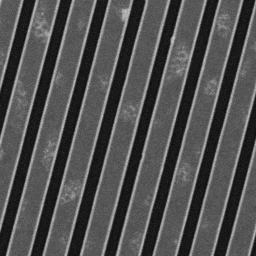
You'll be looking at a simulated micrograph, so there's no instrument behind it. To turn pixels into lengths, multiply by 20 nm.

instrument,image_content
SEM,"parallel lines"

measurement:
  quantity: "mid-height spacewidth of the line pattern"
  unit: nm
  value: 284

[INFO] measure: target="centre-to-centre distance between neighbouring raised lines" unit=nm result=710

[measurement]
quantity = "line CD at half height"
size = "424 nm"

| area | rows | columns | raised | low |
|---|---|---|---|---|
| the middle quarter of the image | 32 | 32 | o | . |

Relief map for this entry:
oooo...oooooo...oooooo....ooooo.
ooo....oooooo...oooooo...oooooo.
ooo....ooooo....ooooo....oooooo.
ooo...oooooo....ooooo....ooooo..
ooo...oooooo...oooooo....ooooo..
oo....ooooo....oooooo...oooooo..
oo....ooooo....ooooo....ooooo...
oo...oooooo....ooooo....ooooo...
oo...oooooo...oooooo....ooooo...
o....ooooo....oooooo...oooooo...
o....ooooo....ooooo....ooooo....
o...oooooo....ooooo....ooooo....
o...oooooo...oooooo....ooooo....
....ooooo....oooooo...oooooo...o
....ooooo....ooooo....ooooo....o
...oooooo....ooooo....ooooo....o
...oooooo...oooooo...oooooo....o
...ooooo....oooooo...oooooo...oo
..oooooo....ooooo....ooooo....oo
..oooooo....ooooo....ooooo....oo
..oooooo...oooooo...oooooo....oo
..ooooo....ooooo....oooooo...ooo
.oooooo....ooooo....ooooo....ooo
.oooooo....ooooo....ooooo....ooo
.oooooo...oooooo...oooooo....ooo
.ooooo....ooooo....oooooo...oooo
oooooo....ooooo....oooooo...oooo
oooooo...oooooo....ooooo....oooo
oooooo...oooooo...oooooo...ooooo
ooooo....ooooo....oooooo...ooooo
ooooo....ooooo....ooooo....ooooo
ooooo...oooooo....ooooo....ooooo